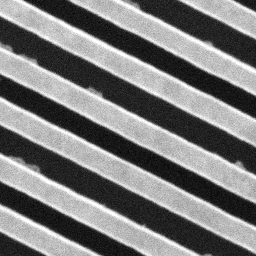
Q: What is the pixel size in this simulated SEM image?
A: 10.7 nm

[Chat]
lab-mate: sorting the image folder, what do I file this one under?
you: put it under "lines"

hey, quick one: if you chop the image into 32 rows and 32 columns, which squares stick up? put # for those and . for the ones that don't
####.....#######.......#######..
#####.......######.......#######
.#######......######.......#####
...######......#######.......###
.....######.......######.......#
.......######......#######......
#........######......#######....
###........######......#######..
#####........######......#######
.######........######......#####
...######........######......###
.....######........######......#
#......######........######.....
###......######........######...
#####......######........######.
######......#######.......######
..#######.....#######.......####
....#######.....#######.......##
......######......#######.......
#.......######......#######.....
###.......######......#######...
####........######......#######.
######........#######.....######
..#######.......######......####
....######........######......##
......#######.......######......
##......######........######....
####......######........######..
######......######........######
.#######......######........####
...#######.....#######........##
.....#######......######........